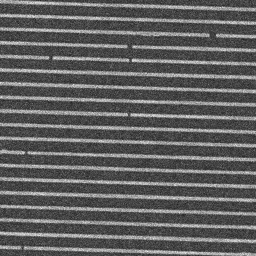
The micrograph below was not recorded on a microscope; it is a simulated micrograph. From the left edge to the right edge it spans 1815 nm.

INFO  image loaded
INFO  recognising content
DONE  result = parallel lines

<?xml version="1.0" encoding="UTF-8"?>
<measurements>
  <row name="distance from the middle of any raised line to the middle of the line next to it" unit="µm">0.0966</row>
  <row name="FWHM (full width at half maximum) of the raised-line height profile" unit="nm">18.6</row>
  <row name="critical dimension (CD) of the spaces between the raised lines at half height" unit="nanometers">77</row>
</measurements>